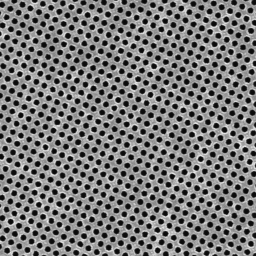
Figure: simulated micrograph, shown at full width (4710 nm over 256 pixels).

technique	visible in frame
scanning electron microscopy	a regular array of holes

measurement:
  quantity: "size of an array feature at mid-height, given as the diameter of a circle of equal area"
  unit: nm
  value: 112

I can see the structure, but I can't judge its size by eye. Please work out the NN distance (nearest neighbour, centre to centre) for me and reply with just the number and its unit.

163 nanometres